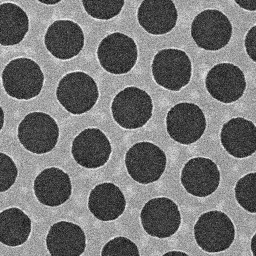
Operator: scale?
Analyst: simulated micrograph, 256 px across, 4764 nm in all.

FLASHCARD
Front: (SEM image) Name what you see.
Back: a regular array of holes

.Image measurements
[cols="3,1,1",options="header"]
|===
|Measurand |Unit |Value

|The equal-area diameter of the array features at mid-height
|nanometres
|774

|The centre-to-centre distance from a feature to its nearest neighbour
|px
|55.2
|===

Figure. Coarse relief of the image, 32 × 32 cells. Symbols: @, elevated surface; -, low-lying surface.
--@@@@-@@@-----@@@----@@@@@@@@--
---@@@@@@@@----@@-----@@@---@@@@
----@@@--@@@@@@@@-----@@-----@@@
----@@----@@@@@@@@----@@-----@@-
---@@@-----@@---@@@@@@@@-----@@-
--@@@@-----@-----@@@@@@@@---@@@-
@@@@@@----@@-----@@@---@@@@@@@@-
@---@@@@@@@@-----@@-----@@@@@@@@
@----@@@@@@@@----@@-----@@@---@@
-----@@@---@@@@@@@@-----@@-----@
-----@@-----@@@@@@@@---@@@-----@
@----@@-----@@@---@@@@@@@@-----@
@@@@@@@-----@@-----@@@@@@@@---@@
@@@@@@@@---@@@-----@@----@@@@@@@
-@@---@@@@@@@@-----@@-----@@@@@@
@@-----@@@@@@@@---@@@-----@@----
@@-----@@@---@@@@@@@@-----@@----
@@-----@@-----@@@@@@@@---@@@----
@@@----@@-----@@----@@@@@@@@----
-@@@@@@@@-----@@-----@@@@@@@@--@
--@@@@@@@@---@@@-----@@----@@@@@
--@@@---@@@@@@@@----@@@----@@@@@
--@@-----@@@@@@@@---@@@-----@@--
-@@@-----@@@---@@@@@@@@----@@---
@@@@-----@@-----@@@@@@@@--@@@---
@@@@@---@@@-----@@----@@@@@@@@--
---@@@@@@@@----@@@----@@@@--@@@-
----@@@@@@@@--@@@@-----@@----@@@
----@@----@@@@@@@@----@@-----@@@
----@@-----@@@@@@@@--@@@-----@@@
---@@@-----@@----@@@@@@@@----@@-
@@@@@@----@@@----@@@@--@@@-@@@@-